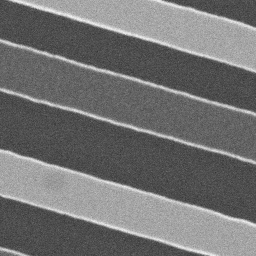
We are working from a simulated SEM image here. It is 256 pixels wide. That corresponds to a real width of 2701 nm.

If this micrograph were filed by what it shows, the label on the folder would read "lines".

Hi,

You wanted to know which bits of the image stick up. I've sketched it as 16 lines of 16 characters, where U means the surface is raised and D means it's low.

DDUUUUUUUUUUDDDD
DDDDDDUUUUUUUUUD
DDDDDDDDDUUUUUUU
UUUUDDDDDDDDDUUU
UUUUUUUDDDDDDDDD
UUUUUUUUUUDDDDDD
DDDUUUUUUUUUUUDD
DDDDDDUUUUUUUUUU
DDDDDDDDDDUUUUUU
DDDDDDDDDDDDDUUU
UUUUDDDDDDDDDDDD
UUUUUUUDDDDDDDDD
DUUUUUUUUUUDDDDD
DDDDUUUUUUUUUUDD
DDDDDDDDUUUUUUUU
DDDDDDDDDDDUUUUU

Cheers